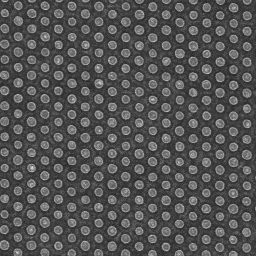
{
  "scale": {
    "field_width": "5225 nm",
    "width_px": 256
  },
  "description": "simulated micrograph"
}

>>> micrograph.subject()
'a regular array of raised bodies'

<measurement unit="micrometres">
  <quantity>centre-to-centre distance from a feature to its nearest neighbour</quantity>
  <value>0.312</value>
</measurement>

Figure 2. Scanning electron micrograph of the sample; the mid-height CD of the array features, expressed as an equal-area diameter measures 174 nm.